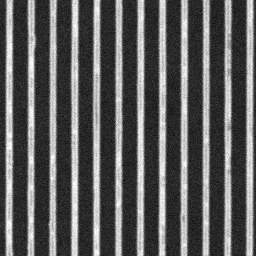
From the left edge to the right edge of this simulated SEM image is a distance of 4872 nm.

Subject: parallel lines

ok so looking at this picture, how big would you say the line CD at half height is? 66.6 nanometers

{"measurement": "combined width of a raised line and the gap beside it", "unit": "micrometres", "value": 0.416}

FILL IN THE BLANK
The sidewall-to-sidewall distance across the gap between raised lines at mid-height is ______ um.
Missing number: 0.359